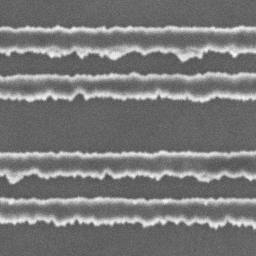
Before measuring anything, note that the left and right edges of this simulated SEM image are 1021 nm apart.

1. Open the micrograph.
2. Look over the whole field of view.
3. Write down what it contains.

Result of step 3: lines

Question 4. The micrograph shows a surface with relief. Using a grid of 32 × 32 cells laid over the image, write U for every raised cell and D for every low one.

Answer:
DDDDDDDDDDDDDDDDDDDDDDDDDDDDDDDD
DDDDDDDDDDDDDDDDDDDDDDDDDDDDDDDD
DDDDDDDDDDDDDDDDDDDDDDDDDDDDDDDD
UDDUUDDUDDDDDDUDUUDDDUUDUDDDDDUU
UUUUUUUUUUUUUUUUUUUUUUUUUUUUUUUU
UUUUUUUUUUUUUUUUUUUUUUUUUUUUUUUU
UDUDDUUUUDUUUUUUDUUDUDUUUUDDDUDU
DDDDDDDDDDDDDDDDDDDDDDDDDDDDDDDD
DDDDDDDDDDDDDDDDDDDDDDDDDDDDDDDD
DDUUDUUUDUUDUUUUUUUUUUUDUUUUUUUU
UUUUUUUUUUUUUUUUUUUUUUUUUUUUUUUU
UUUUUUUUUUUUUUUUUUUUUUUUUUUUUUUU
DDDDDDDDDDDDDDDDDDDDDDDDUUDDDDDD
DDDDDDDDDDDDDDDDDDDDDDDDDDDDDDDD
DDDDDDDDDDDDDDDDDDDDDDDDDDDDDDDD
DDDDDDDDDDDDDDDDDDDDDDDDDDDDDDDD
DDDDDDDDDDDDDDDDDDDDDDDDDDDDDDDD
DDDDDDDDDDDDDDDDDDDDDDDDDDDDDDDD
DDDDDDDDDDDDDDDDDDDDDDDDDDDDDDDD
UUUUUUUUUUUUUUUUUUUUUUUUUUUUUUUU
UUUUUUUUUUUUUUUUUUUUUUUUUUUUUUUU
UUUUUUUUUUUUUUUUUUUUUUUUUUUUUUUU
DUDDDDDDDDDDDDDDDDDDDDDDDUDDDDDD
DDDDDDDDDDDDDDDDDDDDDDDDDDDDDDDD
DDDDDDDDDDDDDDDDDDDDDDDDDDDDDDDD
UUUUUUUUUUUUUUUUUUUUUUUUUUUUUUUU
UUUUUUUUUUUUUUUUUUUUUUUUUUUUUUUU
UUUUUUUUUUUUUUUUUUUUUUUUUUUUUUUU
DDDDDDDDDDDDDDDDDDDDDDDDDDDDDDDD
DDDDDDDDDDDDDDDDDDDDDDDDDDDDDDDD
DDDDDDDDDDDDDDDDDDDDDDDDDDDDDDDD
DDDDDDDDDDDDDDDDDDDDDDDDDDDDDDDD